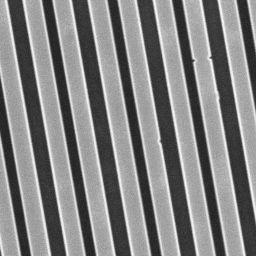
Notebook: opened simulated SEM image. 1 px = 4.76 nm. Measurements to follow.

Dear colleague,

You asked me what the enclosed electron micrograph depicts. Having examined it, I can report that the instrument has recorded parallel lines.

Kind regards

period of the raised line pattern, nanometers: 152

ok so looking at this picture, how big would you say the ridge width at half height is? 85 nm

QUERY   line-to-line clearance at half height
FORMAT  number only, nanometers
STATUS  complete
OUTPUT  76.3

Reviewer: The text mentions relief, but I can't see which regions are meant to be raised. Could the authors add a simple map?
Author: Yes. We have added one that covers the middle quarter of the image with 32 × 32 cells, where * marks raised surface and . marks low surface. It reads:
*****....****...*****....*****..
*****....*****...****....*****..
*****....*****...****.....****..
*****.....****...****.....****..
.****.....****...****.....****..
.****.....****...*****....****..
.*****....****...*****....*****.
.*****....*****...****....*****.
.*****....*****...****.....****.
..****.....****...****.....****.
..****.....****...*****....****.
..****.....****...*****....****.
..*****....****...*****....*****
..*****....*****...****....*****
..*****....*****...****.....****
...****.....****...****.....****
...****.....****...*****....****
...*****....****...*****....****
...*****....*****..*****....****
*..*****....*****...****....****
*..*****....*****...****.....***
*...****.....****...****.....***
*...****.....****...*****....***
*...*****....****...*****....***
*...*****....*****...****....***
**..*****....*****...****....***
**..*****....*****...****.....**
**...****.....****...****.....**
**...****.....****...*****....**
**...*****....****...*****....**
**...*****....*****...****....**
**...*****....*****...****.....*